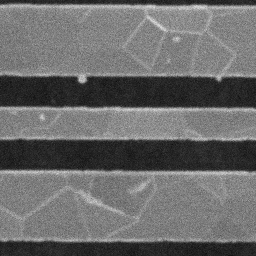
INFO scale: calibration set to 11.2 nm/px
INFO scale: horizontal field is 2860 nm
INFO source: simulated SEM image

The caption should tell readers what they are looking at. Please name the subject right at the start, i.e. lines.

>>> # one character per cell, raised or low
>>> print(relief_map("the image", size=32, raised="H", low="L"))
LLLLLLLLLLLLLLLLLLLLLLLLLLLLLLLL
HHHHHHHHHHHHHHHHHHHHHHHHHHHHHHHH
HHHHHHHHHHHHHHHHHHHHHHHHHHHHHHHH
HHHHHHHHHHHHHHHHHHHHHHHHHHHHHHHH
HHHHHHHHHHHHHHHHHHHHHHHHHHHHHHHH
HHHHHHHHHHHHHHHHHHHHHHHHHHHHHHHH
HHHHHHHHHHHHHHHHHHHHHHHHHHHHHHHH
HHHHHHHHHHHHHHHHHHHHHHHHHHHHHHHH
HHHHHHHHHHHHHHHHHHHHHHHHHHHHHHHH
LLLLLLLLLHHLLLLLLLLLLLLLLLLHLLLL
LLLLLLLLLLLLLLLLLLLLLLLLLLLLLLLL
LLLLLLLLLLLLLLLLLLLLLLLLLLLLLLLL
LLLLLLLLLLLLLLLLLLLLLLLLLLLLLLLL
HHLHHHLLLLLLLLLLLLLLLLLLLLLLLLLL
HHHHHHHHHHHHHHHHHHHHHHHHHHHHHHHH
HHHHHHHHHHHHHHHHHHHHHHHHHHHHHHHH
HHHHHHHHHHHHHHHHHHHHHHHHHHHHHHHH
LLLLLLLLLLLLLLLLLLLLLLLLLLLLLLLL
LLLLLLLLLLLLLLLLLLLLLLLLLLLLLLLL
LLLLLLLLLLLLLLLLLLLLLLLLLLLLLLLL
LLLLLLLLLLLLLLLLLLLLLLLLLLLLLLLL
HHHHHHHHHHHHHHHHHHLLLLLLLLLLLLLL
HHHHHHHHHHHHHHHHHHHHHHHHHHHHHHHH
HHHHHHHHHHHHHHHHHHHHHHHHHHHHHHHH
HHHHHHHHHHHHHHHHHHHHHHHHHHHHHHHH
HHHHHHHHHHHHHHHHHHHHHHHHHHHHHHHH
HHHHHHHHHHHHHHHHHHHHHHHHHHHHHHHH
HHHHHHHHHHHHHHHHHHHHHHHHHHHHHHHH
HHHHHHHHHHHHHHHHHHHHHHHHHHHHHHHH
HHHHHHHHHHHHHHHHHHHHHHHHHHHHHHHH
LLLLLLLLLLLLLLLLLLLLLLLLLLLLLLLL
LLLLLLLLLLLLLLLLLLLLLLLLLLLLLLLL